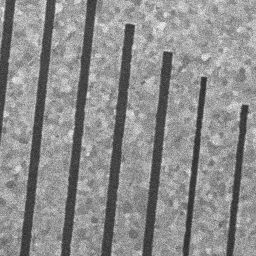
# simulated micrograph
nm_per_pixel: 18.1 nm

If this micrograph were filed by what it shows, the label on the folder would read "parallel lines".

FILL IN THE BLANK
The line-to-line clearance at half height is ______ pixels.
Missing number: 10.7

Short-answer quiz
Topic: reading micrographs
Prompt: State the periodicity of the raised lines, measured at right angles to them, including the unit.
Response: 0.73 um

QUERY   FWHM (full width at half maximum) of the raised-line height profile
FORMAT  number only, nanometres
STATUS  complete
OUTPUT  546